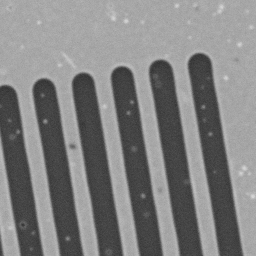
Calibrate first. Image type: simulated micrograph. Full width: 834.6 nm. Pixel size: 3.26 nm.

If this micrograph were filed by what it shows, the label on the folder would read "groups of lines, slits or small figures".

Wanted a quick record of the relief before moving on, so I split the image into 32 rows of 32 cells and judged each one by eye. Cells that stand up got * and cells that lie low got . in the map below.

********************************
********************************
********************************
********************************
********************************
********************************
********************************
************************..******
**************..***...*....*****
*********..***...**...**...*****
****...**...**...**...**...*****
..**...**...**...**...**...*****
..**...**...**...**...**...*****
..**...**...**...**...**...*****
...**...*....**...*....*....****
...**...**...**...**...**...****
...**...**...**...**...**...****
...**...**...**...**...**...****
...**...**...**...**...**...****
...**....*...**...**...**...****
*...**...*....*....**...*....***
*...**...**...**...**...**...***
*...**...**...**...**...**...***
*...**...**...**...**...**...***
*...**...**...**...**...**...***
*....*...**...**...**...**...***
**...*....**...**...*....*....**
**...**...**...**...**...**...**
**...**...**...**...**...**...**
**...**...**...**...**...**...**
**...**...**...**...**...**...**
**...**...**...**...**...**...**